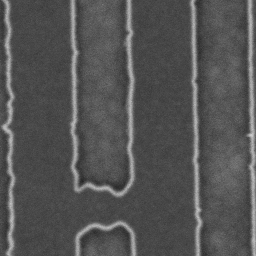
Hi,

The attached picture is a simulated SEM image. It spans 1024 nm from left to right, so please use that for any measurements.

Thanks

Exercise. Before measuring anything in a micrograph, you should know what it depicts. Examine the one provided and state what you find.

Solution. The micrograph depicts one or a few lines or trenches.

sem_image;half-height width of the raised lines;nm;262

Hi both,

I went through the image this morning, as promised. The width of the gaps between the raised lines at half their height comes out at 223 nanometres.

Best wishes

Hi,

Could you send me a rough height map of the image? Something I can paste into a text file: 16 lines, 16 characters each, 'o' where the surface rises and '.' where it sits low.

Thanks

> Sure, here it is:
ooooo...oooo....
ooooo...oooo....
ooooo...oooo....
.oooo...oooo....
.oooo...oooo....
.oooo...oooo....
.oooo...oooo....
.oooo...oooo....
.oooo...oooo....
.oooo...oooo....
.oooo...oooo....
.oooo...oooo....
.ooooooooooo....
.ooooooooooo....
.oooo...oooo....
.oooo...oooo....